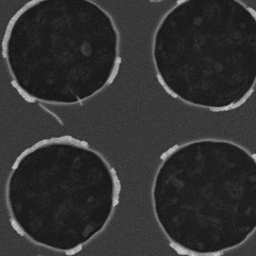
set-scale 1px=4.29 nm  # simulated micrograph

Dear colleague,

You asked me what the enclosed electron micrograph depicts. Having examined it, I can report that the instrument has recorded holes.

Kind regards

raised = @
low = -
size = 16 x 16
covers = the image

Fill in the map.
@@----@@@@@----@
@------@@@------
@------@@@------
@------@@@------
@------@@@------
@-----@@@@@-----
@@@@@@@@@@@@--@@
@@@@@@@@@@@@@@@@
@@@@@@@@@@@@@@@@
@@----@@@@@----@
@------@@@------
@------@@@------
@------@@@------
@------@@@------
@@----@@@@------
@@@-@@@@@@@@--@@